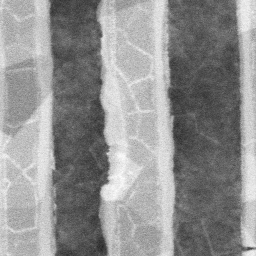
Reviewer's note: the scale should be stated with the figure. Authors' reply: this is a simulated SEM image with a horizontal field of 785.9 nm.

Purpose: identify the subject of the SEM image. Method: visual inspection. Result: one or a few lines or trenches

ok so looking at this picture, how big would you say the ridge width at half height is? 152 nm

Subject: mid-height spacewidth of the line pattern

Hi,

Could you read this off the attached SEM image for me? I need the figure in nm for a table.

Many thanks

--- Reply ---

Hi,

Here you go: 250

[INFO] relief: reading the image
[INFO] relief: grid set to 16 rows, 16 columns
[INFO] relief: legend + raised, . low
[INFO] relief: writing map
+++...++++.....+
+++...++++.....+
+++...++++.....+
+++...++++.....+
+++....+++.....+
+++....+++......
+++....+++......
+++....+++......
+++....+++......
+++.....++......
+++.....++......
+++....+++......
+++....+++......
+++....+++......
+++....+++......
+++....+++......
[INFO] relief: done